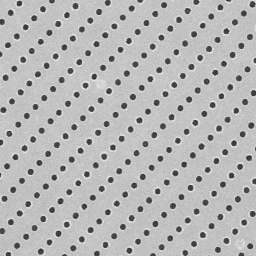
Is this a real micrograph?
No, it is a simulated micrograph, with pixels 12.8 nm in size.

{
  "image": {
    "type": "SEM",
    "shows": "a regular array of holes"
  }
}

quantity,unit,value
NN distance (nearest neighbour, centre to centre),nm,158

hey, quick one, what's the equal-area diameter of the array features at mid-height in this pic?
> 80.3 nanometers